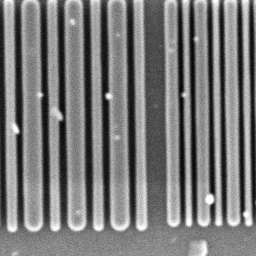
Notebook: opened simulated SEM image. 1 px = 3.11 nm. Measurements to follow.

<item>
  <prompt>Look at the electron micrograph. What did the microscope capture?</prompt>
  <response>groups of lines, slits or small figures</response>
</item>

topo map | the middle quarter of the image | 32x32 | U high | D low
UUUUUDDUUDDUUUUUDDUUDDDDDDUUDDUD
UUUUUDDUUDDUUUUUDDUUDDDDDDUUDDUD
UUUUUDDUUDDUUUUUDDUUDDDDDDUUDDUD
UUUUUDDUUDDUUUUUDDUUDDDDDDUUDDUD
UUUUUDDUUDDUUUUUDDUUDDDDDDUUDDUD
UUUUUDDUUDDUUUUUDDUUDDDDDDUUDDUD
UUUUUDDUUDDUUUUUDDUUDDDDDDUUDDUD
UUUUUDDUUDDUUUUUDDUUDDDDDDUUDDUU
UUUUUDDUUDDUUUUUDDUUDDDDDDUUDDUU
DUUUUDDUUDDDUUUUDDUUDDDDDDUUDDUU
DUUUUDDUUDDDUUUUDDUUDDDDDDUUUDUU
DUUUUDDUUDDDUUUUDDUUDDDDDDUUUDUU
DUUUUDDUUDDDUUUUDDUUDDDDDDUUUDUU
DUUUUDDUUDDDUUUUDDUUDDDDDDUUUDUU
DUUUUDDUUDDDUUUUDDUUDDDDDDUUUDUU
DUUUUDDUUDDDUUUUDDUUDDDDDDUUUDUU
DUUUUDDUUDDDUUUUDDUUDDDDDDUUUDUU
DUUUUDDUUDDDUUUUDDUUDDDDDDUUUDUU
DUUUUDDUUDDDUUUUDDUUDDDDDDUUUDUU
DUUUUDDUUDDDUUUUDDUUDDDDDDUUUDUU
DUUUUDDUUDDDUUUUDDUUDDDDDDUUUDUU
DUUUUDDUUDDDUUUUDDUUDDDDDDUUUDUU
DUUUUDDUUDDDUUUUDDUUDDDDDDUUUDUU
DUUUUDDUUDDDUUUUDDUUDDDDDDUUUDUU
DUUUUDDUUDDDUUUUDDUUDDDDDDUUUDUU
DUUUUDDUUDDDUUUUDDUUDDDDDDUUUDDU
DUUUUDDUUDDDUUUUDDUUDDDDDDUUUDDU
DUUUUDDUUUDDUUUUDDUUDDDDDDUUUDDU
DUUUUDDUUUDDUUUUDDUUDDDDDDUUUDDU
DUUUUDDUUUDDUUUUDDUUDDDDDDUUUDDU
DUUUUDDUUUDDUUUUDDUUDDDDDDUUUDDU
DUUUUDDUUUDDUUUUDDUUDDDDDDUUUDDU